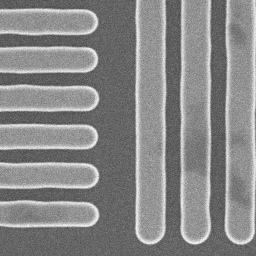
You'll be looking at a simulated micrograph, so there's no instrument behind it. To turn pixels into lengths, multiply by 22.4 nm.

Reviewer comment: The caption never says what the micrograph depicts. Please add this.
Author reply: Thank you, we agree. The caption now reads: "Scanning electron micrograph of groups of lines, slits or small figures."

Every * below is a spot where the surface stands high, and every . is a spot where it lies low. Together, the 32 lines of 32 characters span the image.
.................****..***..****
***********......****..***..****
************.....****..***..****
************.....****..***..****
.................****..***..****
.................****..***..****
************.....****..***..****
************.....****..***..****
************.....****..***..****
.................****..***..****
.................****..***..****
************.....****..***..****
************.....****..***..****
************.....****..***..****
.................****..***..****
.................****..***..****
************.....****..***..****
************.....****..***..****
***********......****..***..****
.................****..***..****
**********.......****..***..****
************.....****..***..****
************.....****..***..****
.................****..***..****
.................****..***..****
***********......****..***..****
************.....****..***..****
************.....****..***..****
.................****..***..****
.................***...***..****
................................
................................